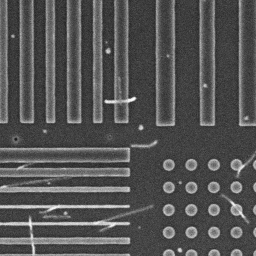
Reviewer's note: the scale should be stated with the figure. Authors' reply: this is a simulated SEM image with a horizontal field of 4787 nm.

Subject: groups of lines, slits or small figures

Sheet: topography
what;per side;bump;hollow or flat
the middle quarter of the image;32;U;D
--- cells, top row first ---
DUUUDDDUUDDDDUUUDDDDDDDUUUUDDDDD
DUUUDDDUUDDDDUUUDDDDDDDUUUUDDDDD
DUUUDDDUUDDDDUUUDDDDDDDUUUUUDDDD
DUUUDDDUUDDDDUUUDDDDDDDUUUUUDDDD
DUUUDDDUUDDDDUUUDDDDDDDUUUUUDDDD
DUUUDDDUUDDDDUUUDDDDDDDUUUUUDDDD
DUUUDDDUUDDDDUUUDDDDDDDUUUUUDDDD
DUUUDDDUUDDDDUUUDDDDDDDUUUUUDDDD
DUUUDDDUUDDDDUUUDUDDDDDUUUUUDDDD
DUUUDDDUUDDDUUUUDDDDDDDUUUUUDDDD
DUUUDDDUUDDDDUUUDDDDDDDUUUUDDDDD
DUUUDDDUUDDDDUUUDDDDDDDUUUUDDDDD
DUUUDDDUUDDDDUUUDDDDDDDUUUUDDDDD
DUUUDDDUUDDDDUUUDDDDDDDUUUUDDDDD
DUUUDDDDUDDDDUUUDDDDDDDUUUUDDDDD
DDDDDDDDDDDDDDDDDDDDDDDDDDDDDDDD
DDDDDDDDDDDDDDDDDDDDDDDDDDDDDDDD
DDDDDDDDDDDDDDDDDDDDDDDDDDDDDDDD
DDDDDDDDDDDDDDDDDDDDDDDDDDDDDDDD
DDDDDDDDDDDDDDDDDDDDDDDDDDDDDDDD
DDDDDDDDDDDDDDDDDDDDDDDDDDDDDDDD
UUUUUUUUUUUUUUUUDDDDDDDDDDDDDDDD
UUUUUUUUUUUUUUUUDDDDDDDDDDDDDDDD
UUUUUUUUUUUUUUUUDDDDDDDDDDDDDDDD
DDDDDDDDDDDDDDDDDDDDDDDDDUUDDDDU
DDDDDDDDDDDDDDDDDDDDDDDDDUUDDDUU
UUUUUUUUUUUUUUUUDDDDDDDDDDUDDDDU
UUUUUUUUUUUUUUUUDDDDDDDDDDDDDDDD
DDDDDDDDDDDDDDDDDDDDDDDDDDDDDDDD
DDDDDDDDDDDDDDDDDDDDDDDDDDDDDDDD
DDDDDDDDDDDDDDDDDDDDDDDDDUUDDDUU
UUUUUUUUUUUUUUUUDDDDDDDDDUUDDDDU